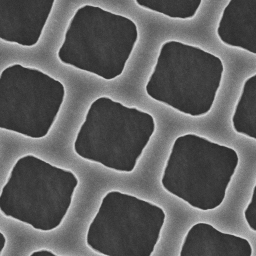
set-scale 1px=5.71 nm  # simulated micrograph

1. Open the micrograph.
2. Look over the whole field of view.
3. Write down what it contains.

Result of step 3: holes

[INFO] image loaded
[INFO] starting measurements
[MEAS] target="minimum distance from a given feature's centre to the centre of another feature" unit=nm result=525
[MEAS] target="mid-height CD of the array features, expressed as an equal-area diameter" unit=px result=71.7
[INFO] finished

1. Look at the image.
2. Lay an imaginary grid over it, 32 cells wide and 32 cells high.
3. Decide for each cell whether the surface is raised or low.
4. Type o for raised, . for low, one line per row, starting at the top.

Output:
.......oooooooooo........oooo...
......oooo....oooooo....oooo....
......ooo.......oooooooooooo....
.....ooo.........oooooooooo.....
.....ooo.........oooooooooo.....
oo..oooo.........oooo..oooooo...
ooooooo.........oooo......ooooo.
oooooooo........oooo.......ooooo
o...oooooo.....oooo.........oooo
......oooooo...oooo.........oooo
........oooooooooo.........oooo.
........oooooooooo.........ooo..
........oooo..oooooo.......ooo..
.......oooo......ooooo....ooo...
.......oooo........oooooooooo...
.......ooo.........oooooooooo...
oo....oooo.........ooooooooooo..
ooooooooo..........ooo....oooooo
ooooooooo.........oooo.......ooo
ooo.oooooo.......oooo.........oo
oo....ooooooo....oooo.........oo
o........oooooooooooo........ooo
o.........oooooooooo.........ooo
.........oooooooooooo.......oooo
.........oooo....ooooo......oooo
.........oooo......ooooo...oooo.
........oooo........ooooooooooo.
oo......oooo.........oooooooooo.
ooooo..oooo.........oooo...oooo.
ooooooooooo.........ooo......ooo
.oooooooooo........oooo........o
oooo..oooooo.......oooo........o